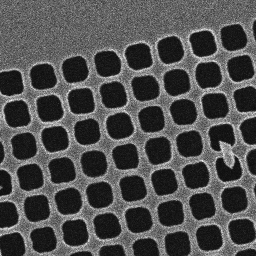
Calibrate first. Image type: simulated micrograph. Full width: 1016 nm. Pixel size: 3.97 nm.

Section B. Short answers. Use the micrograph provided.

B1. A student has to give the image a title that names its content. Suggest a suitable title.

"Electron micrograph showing a regular array of holes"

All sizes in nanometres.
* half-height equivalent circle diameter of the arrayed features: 107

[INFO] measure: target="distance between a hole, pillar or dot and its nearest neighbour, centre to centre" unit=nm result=126